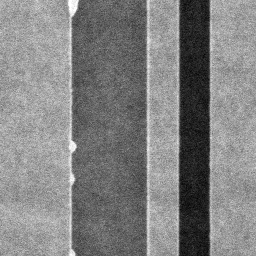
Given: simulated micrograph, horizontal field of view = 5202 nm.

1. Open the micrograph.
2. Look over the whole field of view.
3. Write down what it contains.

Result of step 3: lines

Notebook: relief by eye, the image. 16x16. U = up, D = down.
UUUUUDDDDUUDDUUU
UUUUDDDDDUUDDUUU
UUUUDDDDDUUDDUUU
UUUUDDDDDUUDDUUU
UUUUDDDDDUUDDUUU
UUUUDDDDDUUDDUUU
UUUUDDDDDUUDDUUU
UUUUDDDDDUUDDUUU
UUUUDDDDDUUDDUUU
UUUUUDDDDUUDDUUU
UUUUDDDDDUUDDUUU
UUUUUDDDDUUDDUUU
UUUUDDDDDUUDDUUU
UUUUDDDDDUUDDUUU
UUUUDDDDDUUDDUUU
UUUUDDDDDUUDDUUU